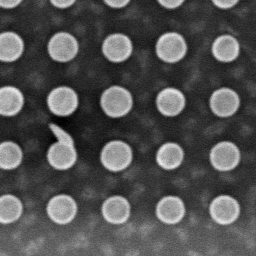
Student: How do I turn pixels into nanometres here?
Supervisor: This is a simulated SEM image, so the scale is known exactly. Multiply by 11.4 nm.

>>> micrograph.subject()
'a regular array of raised bodies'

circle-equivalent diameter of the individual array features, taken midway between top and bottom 323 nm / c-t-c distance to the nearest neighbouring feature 614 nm